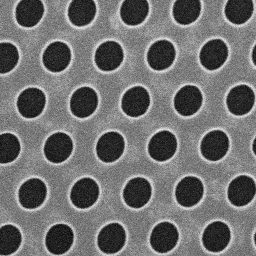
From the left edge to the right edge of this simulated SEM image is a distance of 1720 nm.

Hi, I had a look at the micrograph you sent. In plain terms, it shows a regular array of holes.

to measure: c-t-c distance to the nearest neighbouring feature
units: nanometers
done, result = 349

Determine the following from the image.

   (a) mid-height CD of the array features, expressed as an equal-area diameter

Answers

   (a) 203 nm